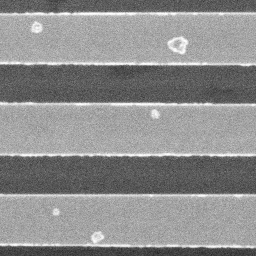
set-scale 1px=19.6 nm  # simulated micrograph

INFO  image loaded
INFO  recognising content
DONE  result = lines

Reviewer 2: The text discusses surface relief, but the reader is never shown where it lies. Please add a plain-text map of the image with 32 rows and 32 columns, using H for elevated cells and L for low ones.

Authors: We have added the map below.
LLLLLLLLLLLLLLLLLLLLLLLLLLLLLLLL
LLLLLLLLLLLLLLLLLLLLLLLLLLLLLLLL
HHHHHHHHHHHHHHHHHHHHHHHHHHHHHHHH
HHHHHHHHHHHHHHHHHHHHHHHHHHHHHHHH
HHHHHHHHHHHHHHHHHHHHHHHHHHHHHHHH
HHHHHHHHHHHHHHHHHHHHHHHHHHHHHHHH
HHHHHHHHHHHHHHHHHHHHHHHHHHHHHHHH
HHHHHHHHHHHHHHHHHHHHHHHHHHHHHHHH
LLLLLLLLLLLLLLLLLLLLLLLLLLLLLLLL
LLLLLLLLLLLLLLLLLLLLLLLLLLLLLLLL
LLLLLLLLLLLLLLLLLLLLLLLLLLLLLLLL
LLLLLLLLLLLLLLLLLLLLLLLLLLLLLLLL
LLLLLLLLLLLLLLLLLLLLLLLLLLLLLLLL
HHHHHHHHHHHHHHHHHHHHHHHHHHHHHHHH
HHHHHHHHHHHHHHHHHHHHHHHHHHHHHHHH
HHHHHHHHHHHHHHHHHHHHHHHHHHHHHHHH
HHHHHHHHHHHHHHHHHHHHHHHHHHHHHHHH
HHHHHHHHHHHHHHHHHHHHHHHHHHHHHHHH
HHHHHHHHHHHHHHHHHHHHHHHHHHHHHHHH
LLLLLLLLLLLLLLLLLLLLLLLLLLLLLLLL
LLLLLLLLLLLLLLLLLLLLLLLLLLLLLLLL
LLLLLLLLLLLLLLLLLLLLLLLLLLLLLLLL
LLLLLLLLLLLLLLLLLLLLLLLLLLLLLLLL
LLLLLLLLLLLLLLLLLLLLLLLLLLLLLLLL
HHHHHHHHHHHHHHHHHHHHHHHHHHHHHHHH
HHHHHHHHHHHHHHHHHHHHHHHHHHHHHHHH
HHHHHHHHHHHHHHHHHHHHHHHHHHHHHHHH
HHHHHHHHHHHHHHHHHHHHHHHHHHHHHHHH
HHHHHHHHHHHHHHHHHHHHHHHHHHHHHHHH
HHHHHHHHHHHHHHHHHHHHHHHHHHHHHHHH
HHHHHHHHHHHHHHHHHHHHHHHHHHHHHHHH
LLLLLLLLLLLLLLLLLLLLLLLLLLLLLLLL